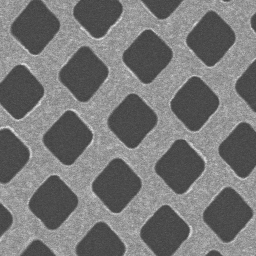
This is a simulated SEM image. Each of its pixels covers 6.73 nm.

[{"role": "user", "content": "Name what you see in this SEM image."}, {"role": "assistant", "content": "a regular array of holes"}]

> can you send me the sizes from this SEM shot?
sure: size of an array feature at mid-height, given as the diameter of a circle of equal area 314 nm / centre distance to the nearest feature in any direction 442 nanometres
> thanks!